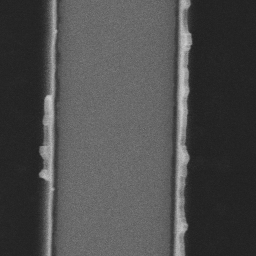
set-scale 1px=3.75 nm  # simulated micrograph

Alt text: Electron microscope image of one or a few lines or trenches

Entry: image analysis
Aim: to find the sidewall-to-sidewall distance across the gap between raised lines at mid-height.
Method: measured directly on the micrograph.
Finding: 0.47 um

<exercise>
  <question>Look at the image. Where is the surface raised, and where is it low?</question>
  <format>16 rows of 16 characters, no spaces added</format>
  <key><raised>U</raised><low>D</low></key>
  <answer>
UUUDDDDDDDDUUUUU
UUUDDDDDDDDUUUUU
UUUDDDDDDDDUUUUU
UUUDDDDDDDDUUUUU
UUUDDDDDDDDUUUUU
UUUDDDDDDDDUUUUU
UUUDDDDDDDDUUUUU
UUUDDDDDDDDUUUUU
UUUDDDDDDDDUUUUU
UUUDDDDDDDDUUUUU
UUUDDDDDDDDUUUUU
UUUDDDDDDDDUUUUU
UUUDDDDDDDDUUUUU
UUUDDDDDDDDUUUUU
UUUDDDDDDDDUUUUU
UUUDDDDDDDDUUUUU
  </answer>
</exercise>